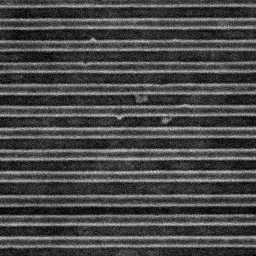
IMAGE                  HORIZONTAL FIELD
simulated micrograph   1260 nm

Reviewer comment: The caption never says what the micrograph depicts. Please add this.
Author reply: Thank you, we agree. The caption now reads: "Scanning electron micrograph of parallel lines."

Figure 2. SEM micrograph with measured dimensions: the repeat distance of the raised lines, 107 nm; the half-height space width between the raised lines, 62.7 nanometres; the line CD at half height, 0.0479 micrometres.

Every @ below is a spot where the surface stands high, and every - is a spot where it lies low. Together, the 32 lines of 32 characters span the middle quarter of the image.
@@@@@@@@@@@@@@@@@@@@@@@@@@@@@@@@
@@@@@@@@@@@@@@@@@@@@@@@@@@@@@@@@
--------------------------------
--------------------------------
--------------------------------
@@@@@@@@@@@@@@@@@@@@@@@@-@@@@@@@
@@@@@@@@@@@@@@@@@@@@@@@@@@@@@@@@
----------@@@@------------------
--------------------------------
--------------------------------
-----------------------------@@-
@@@@@@@@@@@@@@@@@@@@@@@@@@@@@@@@
@@@@@@@@@@@@@@@@@@@@@@@@@@@@@@@@
--------------------------------
--------------------------------
--------------------------------
@@@@@@@@@@@@@@@@@@@@@@@@@@@@@@@@
@@@@@@@@@@@@@@@@@@@@@@@@@@@@@@@@
--------------------------------
--------------------------------
--------------------------------
------------@@@@@@@@@@@---------
@@@@@@@@@@@@@@@@@@@@@@@@@@@@@@@@
@@@@@@@@@@@@@@@@@@@@@@@@@@@@@@@@
--------------------------------
--------------------------------
--------------------------------
@@@@@@@@@@@@@@@@@@@@@@@@@@@@@@@@
@@@@@@@@@@@@@@@@@@@@@@@@@@@@@@@@
--------------------------------
--------------------------------
--------------------------------